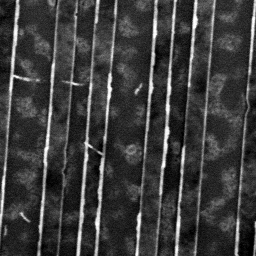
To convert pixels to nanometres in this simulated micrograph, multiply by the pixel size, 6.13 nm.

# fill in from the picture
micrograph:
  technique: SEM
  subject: parallel lines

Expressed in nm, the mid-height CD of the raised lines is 125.